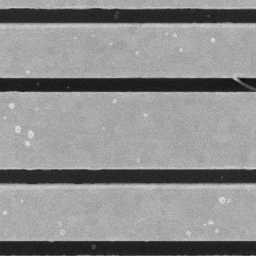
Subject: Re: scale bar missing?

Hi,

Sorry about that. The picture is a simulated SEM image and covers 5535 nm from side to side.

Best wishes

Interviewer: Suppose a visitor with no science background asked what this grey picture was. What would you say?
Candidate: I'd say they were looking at lines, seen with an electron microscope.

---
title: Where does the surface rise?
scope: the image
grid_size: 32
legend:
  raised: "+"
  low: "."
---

++++++++++++++++++++++++++++++++
................................
................................
++++++++++++++++++++++++++++++++
++++++++++++++++++++++++++++++++
++++++++++++++++++++++++++++++++
++++++++++++++++++++++++++++++++
++++++++++++++++++++++++++++++++
++++++++++++++++++++++++++++++++
++++++++++++++++++++++++++++++++
................................
.++.............................
++++++++++++++++++++++++++++++++
++++++++++++++++++++++++++++++++
++++++++++++++++++++++++++++++++
++++++++++++++++++++++++++++++++
++++++++++++++++++++++++++++++++
++++++++++++++++++++++++++++++++
++++++++++++++++++++++++++++++++
++++++++++++++++++++++++++++++++
++++++++++++++++++++++++++++++++
................................
................................
++++++++++++++++++++++++++++++++
++++++++++++++++++++++++++++++++
++++++++++++++++++++++++++++++++
++++++++++++++++++++++++++++++++
++++++++++++++++++++++++++++++++
++++++++++++++++++++++++++++++++
++++++++++++++++++++++++++++++++
................................
................................